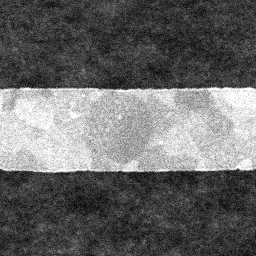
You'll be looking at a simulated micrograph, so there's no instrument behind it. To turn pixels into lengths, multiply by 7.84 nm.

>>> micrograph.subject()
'one or a few lines or trenches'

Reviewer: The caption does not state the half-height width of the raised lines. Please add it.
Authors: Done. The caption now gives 637 nm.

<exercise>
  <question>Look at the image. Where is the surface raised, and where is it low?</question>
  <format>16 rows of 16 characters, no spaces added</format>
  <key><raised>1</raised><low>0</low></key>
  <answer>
0000000000000000
0000000000000000
0000000000000000
0000000000000000
0000000000000000
0000000000000000
1111111111111111
1111111111111111
1111111111111111
1111111111111111
1111111111111111
0000000000000000
0000000000000000
0000000000000000
0000000000000000
0000000000000000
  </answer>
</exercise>